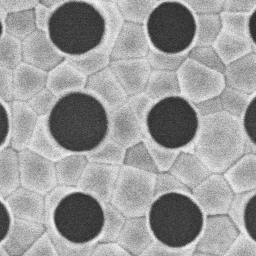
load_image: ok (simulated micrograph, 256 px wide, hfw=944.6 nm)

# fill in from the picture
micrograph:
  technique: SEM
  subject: holes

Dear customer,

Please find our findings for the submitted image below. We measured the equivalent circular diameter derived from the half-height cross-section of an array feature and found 193 nm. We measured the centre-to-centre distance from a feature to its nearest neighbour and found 350 nm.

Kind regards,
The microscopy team